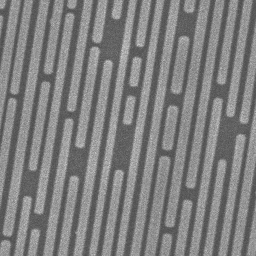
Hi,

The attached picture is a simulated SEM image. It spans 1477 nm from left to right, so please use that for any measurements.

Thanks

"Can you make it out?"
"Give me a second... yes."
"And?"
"parallel lines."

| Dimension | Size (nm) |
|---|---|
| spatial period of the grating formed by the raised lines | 82.8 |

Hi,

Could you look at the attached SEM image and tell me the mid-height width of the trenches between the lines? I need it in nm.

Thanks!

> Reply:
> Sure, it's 33.5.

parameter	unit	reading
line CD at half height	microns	0.0499